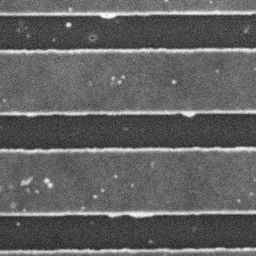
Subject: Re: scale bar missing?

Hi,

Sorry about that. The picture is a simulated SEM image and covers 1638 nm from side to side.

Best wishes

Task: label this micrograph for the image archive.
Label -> lines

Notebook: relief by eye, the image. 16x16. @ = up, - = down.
@@@@@@@@@@@@@@@@
----------------
----------------
@@@@@@@@@@@@@@@@
@@@@@@@@@@@@@@@@
@@@@@@@@@@@@@@@@
@@@@@@@@@@@@@@@@
----------------
----------------
@@@@@@@@@@@@@@@@
@@@@@@@@@@@@@@@@
@@@@@@@@@@@@@@@@
@@@@@@@@@@@@@@@@
----------------
----------------
----------------